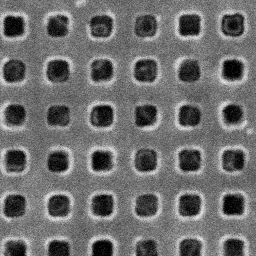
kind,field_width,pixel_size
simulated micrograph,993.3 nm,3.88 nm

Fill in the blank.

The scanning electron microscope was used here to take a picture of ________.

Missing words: a regular array of holes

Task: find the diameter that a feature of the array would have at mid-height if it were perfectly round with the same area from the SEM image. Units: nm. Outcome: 91.4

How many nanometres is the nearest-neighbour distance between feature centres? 168